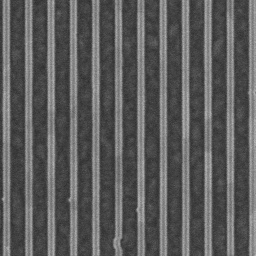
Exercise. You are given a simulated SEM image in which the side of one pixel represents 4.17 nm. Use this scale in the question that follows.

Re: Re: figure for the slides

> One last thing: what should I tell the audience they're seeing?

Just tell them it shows parallel lines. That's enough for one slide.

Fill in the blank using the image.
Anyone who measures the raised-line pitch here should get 93.5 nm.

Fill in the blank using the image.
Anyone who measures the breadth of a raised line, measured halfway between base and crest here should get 0.0245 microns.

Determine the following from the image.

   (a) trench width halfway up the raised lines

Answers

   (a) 70.4 nanometres